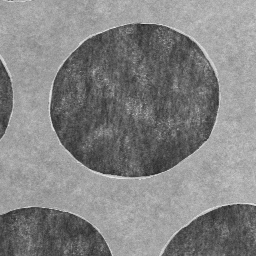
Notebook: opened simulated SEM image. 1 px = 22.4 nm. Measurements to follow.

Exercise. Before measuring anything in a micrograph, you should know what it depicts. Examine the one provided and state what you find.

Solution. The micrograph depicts holes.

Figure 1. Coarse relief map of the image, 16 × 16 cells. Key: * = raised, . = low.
****************
********..******
*****.......****
****.........***
****.........***
.**...........**
.**...........**
.**..........***
****.........***
****........****
*****......*****
****************
****************
.....*******....
......*****.....
.......***......